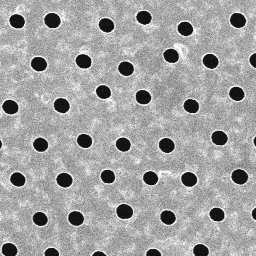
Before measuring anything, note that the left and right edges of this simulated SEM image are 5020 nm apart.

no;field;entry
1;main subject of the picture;a regular array of holes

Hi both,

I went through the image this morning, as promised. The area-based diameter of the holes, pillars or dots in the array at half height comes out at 0.298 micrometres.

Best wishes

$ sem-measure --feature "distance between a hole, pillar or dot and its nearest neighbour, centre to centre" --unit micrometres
0.756